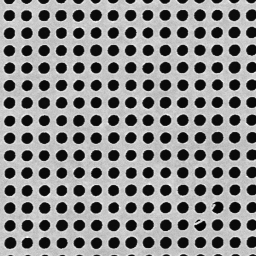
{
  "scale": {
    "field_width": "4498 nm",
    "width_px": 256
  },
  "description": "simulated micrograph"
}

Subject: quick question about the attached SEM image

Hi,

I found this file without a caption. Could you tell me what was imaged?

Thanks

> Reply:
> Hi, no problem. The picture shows a regular array of holes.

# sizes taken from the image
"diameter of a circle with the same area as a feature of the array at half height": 202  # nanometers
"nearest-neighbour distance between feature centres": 0.301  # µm